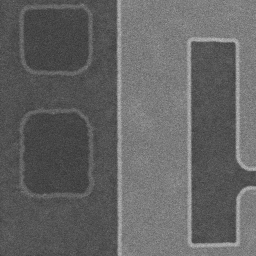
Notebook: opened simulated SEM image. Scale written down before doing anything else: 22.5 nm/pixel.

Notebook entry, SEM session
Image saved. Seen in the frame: one or a few lines or trenches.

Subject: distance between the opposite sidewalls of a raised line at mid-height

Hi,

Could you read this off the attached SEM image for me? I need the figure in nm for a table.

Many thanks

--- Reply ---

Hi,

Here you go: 1570